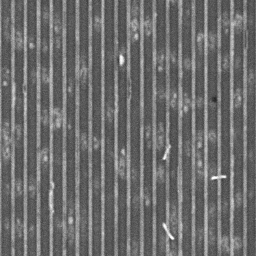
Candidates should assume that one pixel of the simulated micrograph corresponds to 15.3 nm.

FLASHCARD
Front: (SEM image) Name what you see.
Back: parallel lines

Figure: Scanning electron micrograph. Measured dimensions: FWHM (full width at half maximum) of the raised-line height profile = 44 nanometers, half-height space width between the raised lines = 161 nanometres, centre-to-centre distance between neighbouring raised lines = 0.198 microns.